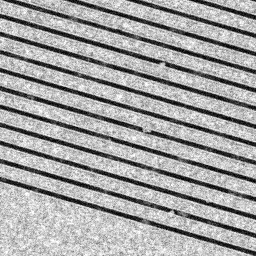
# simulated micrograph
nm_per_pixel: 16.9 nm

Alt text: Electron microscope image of parallel lines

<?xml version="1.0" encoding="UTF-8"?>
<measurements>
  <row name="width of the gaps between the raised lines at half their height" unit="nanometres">97.1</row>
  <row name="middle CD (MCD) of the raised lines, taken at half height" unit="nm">194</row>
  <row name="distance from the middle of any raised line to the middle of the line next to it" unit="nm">293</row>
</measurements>